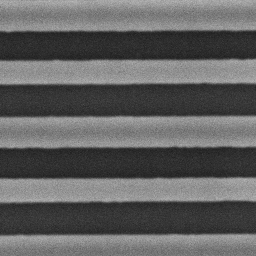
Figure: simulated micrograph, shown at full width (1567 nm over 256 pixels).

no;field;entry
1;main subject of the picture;lines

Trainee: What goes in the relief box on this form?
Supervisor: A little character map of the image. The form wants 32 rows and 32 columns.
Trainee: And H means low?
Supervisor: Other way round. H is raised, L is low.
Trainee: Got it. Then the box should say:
HHHHHHHHHHHHHHHHHHHHHHHHHHHHHHHH
HHHHHHHHHHHHHHHHHHHHHHHHHHHHHHHH
HHHHHHHHHHHHHHHHHHHHHHHHHHHHHHHH
HHHHHHHHHHHHHHHHHHHHHHHHHHHHHHHH
LLLLLLLLLLLLLLLLLLLLLLLLLLLLLLLL
LLLLLLLLLLLLLLLLLLLLLLLLLLLLLLLL
LLLLLLLLLLLLLLLLLLLLLLLLLLLLLLLL
LLLLLLLLLLLLLLLLLLLLLLLLLLLLHHLH
HHHHHHHHHHHHHHHHHHHHHHHHHHHHHHHH
HHHHHHHHHHHHHHHHHHHHHHHHHHHHHHHH
HLLLLLLLLLLLLLLLLLLLLLLLLLLLLLLL
LLLLLLLLLLLLLLLLLLLLLLLLLLLLLLLL
LLLLLLLLLLLLLLLLLLLLLLLLLLLLLLLL
LLLLLLLLLLLLLLLLLLLLLLLLLLLLLLLL
LLLLLLLLLLLLLLLLLLLLLLLLLLLLLLLL
HHHHHHHHHHHHHHHHHHHHHHHHHHHHHHHH
HHHHHHHHHHHHHHHHHHHHHHHHHHHHHHHH
HHHHHHHHHHHHHHHHHHHHHHHHHHHHHHHH
LLLLLLLLLLLLLLLLLLLLLLLLLLLLLLLL
LLLLLLLLLLLLLLLLLLLLLLLLLLLLLLLL
LLLLLLLLLLLLLLLLLLLLLLLLLLLLLLLL
LLLLLLLLLLLLLLLLLLLLLLLLLLLLLLLL
HHHHHHHHHHHHHHHHHHHHHHHHHHHHHHHH
HHHHHHHHHHHHHHHHHHHHHHHHHHHHHHHH
HHHHHHHHHHHHHHHHHHHHHHHHHHHHHHHH
LLLLLLLLLLLLLLLLLLLLLLLLLLLLLLLL
LLLLLLLLLLLLLLLLLLLLLLLLLLLLLLLL
LLLLLLLLLLLLLLLLLLLLLLLLLLLLLLLL
LLLLLLLLLLLLLLLLLLLLLLLLLLLLLLLL
LLLLLLLLLLLLLLLHLLLLLHHHHHHHHHHH
HHHHHHHHHHHHHHHHHHHHHHHHHHHHHHHH
HHHHHHHHHHHHHHHHHHHHHHHHHHHHHHHH